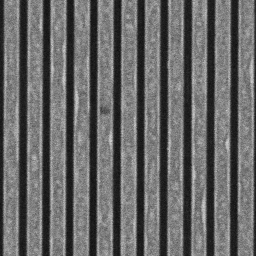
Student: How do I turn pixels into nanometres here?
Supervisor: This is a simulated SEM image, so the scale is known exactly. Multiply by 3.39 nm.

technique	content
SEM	parallel lines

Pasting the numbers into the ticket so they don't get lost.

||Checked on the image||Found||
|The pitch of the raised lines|79.4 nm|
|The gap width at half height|0.0233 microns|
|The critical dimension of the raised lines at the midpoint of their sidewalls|0.0565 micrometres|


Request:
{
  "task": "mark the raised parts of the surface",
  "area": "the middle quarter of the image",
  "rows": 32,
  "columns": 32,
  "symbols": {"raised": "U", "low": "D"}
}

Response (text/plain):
DDDUUUDDDUUUDDUUUUDDUUUUDDUUUUDD
DDDUUUDDDUUUDDUUUUDDUUUUDDUUUUDD
DDDUUUDDDUUUDDUUUUDDUUUUDDUUUUDD
DDDUUUDDDUUUDDUUUUDDUUUUDDUUUUDD
UDDUUUDDUUUUDDUUUUDDUUUUDDUUUUDD
DDDUUUDDUUUUDDUUUUDDUUUUDDUUUUDD
UDDUUUDDUUUUDDUUUUDDUUUUDDUUUUDD
DDDUUUDDUUUUDDUUUUDDUUUUDDUUUUDD
DDDUUUDDUUUUDDUUUUDDUUUUDDUUUUDD
UDDUUUDDUUUUDDUUUUDDUUUUDDUUUUDD
UDDUUUDDUUUUDDUUUUDDUUUUDDUUUUDD
DDDUUUDDUUUUDDUUUUDDUUUUDDUUUUDD
DDDUUUDDUUUUDDUUUUDDUUUUDDUUUUDD
DDDUUUDDUUUUDDUUUUDDUUUUDDUUUUDD
DDDUUUDDUUUUDDUUUUDDUUUUDDUUUUDD
DDDUUUDDUUUUDDUUUUDDUUUUDDUUUUDD
DDDUUUDDUUUUDDUUUUDDUUUUDDUUUUDD
DDDUUUDDUUUUDDUUUUDDUUUUDDUUUUDD
DDDUUUDDUUUUDDUUUUDDUUUUDDUUUUDD
DDDUUUDDUUUUDDUUUUDDUUUUDDUUUUDD
DDDUUUDDUUUUDDUUUUDDUUUUDDUUUUDD
UDDUUUDDUUUUDDUUUUDDUUUUDDUUUUDD
UDDUUUDDUUUUDDUUUUDDUUUUDDUUUUDD
UDDUUUDDUUUUDDUUUUDDUUUUDDUUUUDD
UDDUUUDDUUUUDDUUUUDDUUUUDDUUUUDD
UDDUUUDDUUUUDDUUUUDDUUUUDDUUUUDD
UDDUUUDDUUUUDDUUUUDDUUUUDDUUUUDD
UDDUUUDDUUUUDDUUUUDDUUUUDDUUUUDD
DDDUUUDDUUUUDDUUUUDDUUUUDDUUUUDD
DDUUUUDDUUUUDDUUUUDDUUUUDDUUUUDD
UDUUUUDDUUUUDDUUUUDDUUUUDDUUUUDD
UDUUUUDDUUUUDDUUUUDDUUUUDDUUUUDD